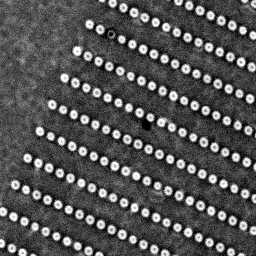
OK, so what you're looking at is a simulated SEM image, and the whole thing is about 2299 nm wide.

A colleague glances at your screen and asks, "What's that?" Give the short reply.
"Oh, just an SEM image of a regular array of raised bodies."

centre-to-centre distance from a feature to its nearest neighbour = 105 nm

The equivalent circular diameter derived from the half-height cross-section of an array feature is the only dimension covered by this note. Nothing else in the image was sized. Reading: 66.4 nanometres